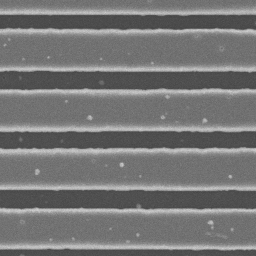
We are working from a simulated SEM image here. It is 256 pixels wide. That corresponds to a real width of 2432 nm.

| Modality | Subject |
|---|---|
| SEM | lines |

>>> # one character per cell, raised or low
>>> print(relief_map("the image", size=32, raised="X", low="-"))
XXXXXXXXXXXXXXXXXXXXXXXXXXXXXXXX
XXXXXXXXXXXXXXXXXXXXXXXXXXXXXXXX
--------------------------------
--------------------------------
XXXXXXXXXXXXXXXXXXXXXXXXXXXXXXXX
XXXXXXXXXXXXXXXXXXXXXXXXXXXXXXXX
XXXXXXXXXXXXXXXXXXXXXXXXXXXXXXXX
XXXXXXXXXXXXXXXXXXXXXXXXXXXXXXXX
XXXXXXXXXXXXXXXXXXXXXXXXXXXXXXXX
--------------------------------
--------------------------------
XXXXXXXXXXXXXXXXXXXXXXXXXXXXXXXX
XXXXXXXXXXXXXXXXXXXXXXXXXXXXXXXX
XXXXXXXXXXXXXXXXXXXXXXXXXXXXXXXX
XXXXXXXXXXXXXXXXXXXXXXXXXXXXXXXX
XXXXXXXXXXXXXXXXXXXXXXXXXXXXXXXX
--------------------------------
--------------------------------
--------------------------------
XXXXXXXXXXXXXXXXXXXXXXXXXXXXXXXX
XXXXXXXXXXXXXXXXXXXXXXXXXXXXXXXX
XXXXXXXXXXXXXXXXXXXXXXXXXXXXXXXX
XXXXXXXXXXXXXXXXXXXXXXXXXXXXXXXX
XXXXXXXXXXXXXXXXXXXXXXXXXXXXXXXX
--------------------------------
--------------------------------
XXXXXXXXXXXXXXXXXXXXXXXXXXXXXXXX
XXXXXXXXXXXXXXXXXXXXXXXXXXXXXXXX
XXXXXXXXXXXXXXXXXXXXXXXXXXXXXXXX
XXXXXXXXXXXXXXXXXXXXXXXXXXXXXXXX
XXXXXXXXXXXXXXXXXXXXXXXXXXXXXXXX
--------------------------------